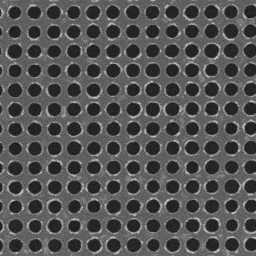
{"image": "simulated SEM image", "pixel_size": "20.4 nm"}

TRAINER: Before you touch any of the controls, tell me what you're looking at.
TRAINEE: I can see a regular array of holes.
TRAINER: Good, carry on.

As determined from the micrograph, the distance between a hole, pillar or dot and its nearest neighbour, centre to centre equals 0.393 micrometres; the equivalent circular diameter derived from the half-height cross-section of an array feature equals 13.8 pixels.